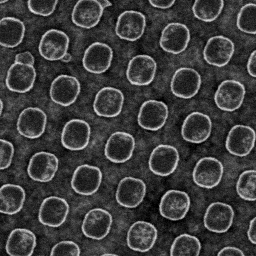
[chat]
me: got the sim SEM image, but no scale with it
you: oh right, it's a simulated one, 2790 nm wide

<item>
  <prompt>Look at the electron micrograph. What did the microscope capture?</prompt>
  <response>a regular array of raised bodies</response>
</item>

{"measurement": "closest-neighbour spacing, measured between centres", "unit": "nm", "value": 496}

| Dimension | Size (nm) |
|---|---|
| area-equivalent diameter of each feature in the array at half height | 317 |